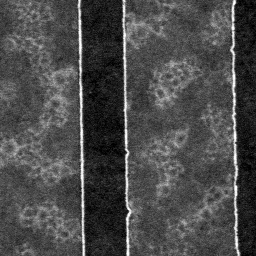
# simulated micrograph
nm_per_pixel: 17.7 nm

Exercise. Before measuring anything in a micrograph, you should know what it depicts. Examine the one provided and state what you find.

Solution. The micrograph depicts one or a few lines or trenches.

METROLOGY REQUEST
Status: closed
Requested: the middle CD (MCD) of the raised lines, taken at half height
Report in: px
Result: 45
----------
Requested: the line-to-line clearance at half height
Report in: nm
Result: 1920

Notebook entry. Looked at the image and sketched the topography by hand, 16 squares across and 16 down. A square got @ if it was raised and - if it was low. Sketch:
-----@@@-------@
-----@@@-------@
-----@@@-------@
-----@@@-------@
-----@@@-------@
-----@@@-------@
-----@@@-------@
-----@@@-------@
-----@@@-------@
-----@@@-------@
-----@@@-------@
-----@@@-------@
-----@@@-------@
-----@@@-------@
-----@@@-------@
-----@@@-------@